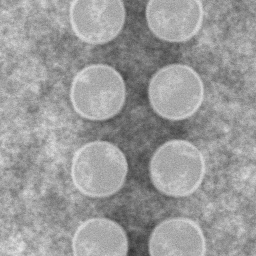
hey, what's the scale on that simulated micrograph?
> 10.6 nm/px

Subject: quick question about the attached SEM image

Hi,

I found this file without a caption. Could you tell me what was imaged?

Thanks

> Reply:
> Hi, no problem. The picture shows raised bodies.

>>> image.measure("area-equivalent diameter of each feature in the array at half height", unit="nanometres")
575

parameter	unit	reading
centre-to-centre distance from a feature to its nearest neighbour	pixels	76.4